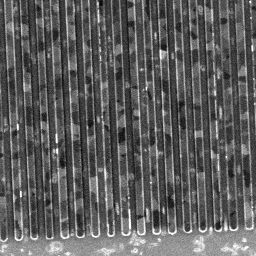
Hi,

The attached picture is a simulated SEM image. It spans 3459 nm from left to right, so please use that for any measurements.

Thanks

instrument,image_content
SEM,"parallel lines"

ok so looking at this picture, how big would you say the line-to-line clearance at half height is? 105 nm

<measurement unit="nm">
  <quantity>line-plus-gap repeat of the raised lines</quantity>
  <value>208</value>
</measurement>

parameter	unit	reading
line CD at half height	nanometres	105